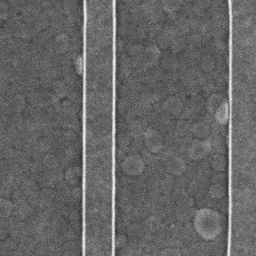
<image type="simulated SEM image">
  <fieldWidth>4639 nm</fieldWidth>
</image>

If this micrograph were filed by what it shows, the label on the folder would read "one or a few lines or trenches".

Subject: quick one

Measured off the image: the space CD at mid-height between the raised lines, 116 pixels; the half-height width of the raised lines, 539 nanometres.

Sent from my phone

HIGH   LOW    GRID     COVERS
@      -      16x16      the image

-----@@-------@@
-----@@-------@@
-----@@-------@@
-----@@-------@@
-----@@-------@@
-----@@-------@@
-----@@-------@@
-----@@-------@@
-----@@-------@@
-----@@-------@@
-----@@-------@@
-----@@-------@@
-----@@-------@@
-----@@-------@@
-----@@-------@@
-----@@-------@@